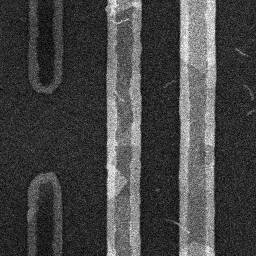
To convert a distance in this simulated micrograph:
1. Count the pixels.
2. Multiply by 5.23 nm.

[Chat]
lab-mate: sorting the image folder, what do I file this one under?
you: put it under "one or a few lines or trenches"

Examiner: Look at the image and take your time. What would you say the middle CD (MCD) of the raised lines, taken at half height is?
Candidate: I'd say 140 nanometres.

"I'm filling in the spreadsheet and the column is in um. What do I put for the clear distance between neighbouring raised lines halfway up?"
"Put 0.248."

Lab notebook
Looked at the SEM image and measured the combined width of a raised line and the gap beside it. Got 391 nanometres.